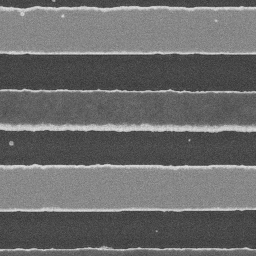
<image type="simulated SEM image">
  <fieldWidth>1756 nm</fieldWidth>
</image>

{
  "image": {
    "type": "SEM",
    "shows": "lines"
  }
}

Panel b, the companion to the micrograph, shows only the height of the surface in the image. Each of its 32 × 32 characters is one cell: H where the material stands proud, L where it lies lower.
LLLLLLLLLLLLLLLLLLLLLLLLLLLLLLLL
HHHHHHHHHHHHHHHHHHHHHHHHHHHHHHHH
HHHHHHHHHHHHHHHHHHHHHHHHHHHHHHHH
HHHHHHHHHHHHHHHHHHHHHHHHHHHHHHHH
HHHHHHHHHHHHHHHHHHHHHHHHHHHHHHHH
HHHHHHHHHHHHHHHHHHHHHHHHHHHHHHHH
HHHHHHHHHHHHHHHHHHHHHHHHHHHHHHHH
LLLLLLLLLLLLLLLLLLLLLLLLLLLLLLLL
LLLLLLLLLLLLLLLLLLLLLLLLLLLLLLLL
LLLLLLLLLLLLLLLLLLLLLLLLLLLLLLLL
LLLLLLLLLLLLLLLLLLLLLLLLLLLLLLLL
HHHHHHHHHHHHHHHHHHHHHHHHHHHHHHHH
HHHHHHHHHHHHHHHHHHHHHHHHHHHHHHHH
HHHHHHHHHHHHHHHHHHHHHHHHHHHHHHHH
HHHHHHHHHHHHHHHHHHHHHHHHHHHHHHHH
HHHHHHHHHHHHHHHHHHHHHHHHHHHHHHHH
LLLLLLLLLLLLLLLLLLLLLLLLLLLLLLLL
LLLLLLLLLLLLLLLLLLLLLLLLLLLLLLLL
LLLLLLLLLLLLLLLLLLLLLLLLLLLLLLLL
LLLLLLLLLLLLLLLLLLLLLLLLLLLLLLLL
LLLLLLLLLLLLLLLLLLLLLLLLLLLLLLLL
HHHHHHHHHHHHHHHHHHHHHHHHHHHHHHHH
HHHHHHHHHHHHHHHHHHHHHHHHHHHHHHHH
HHHHHHHHHHHHHHHHHHHHHHHHHHHHHHHH
HHHHHHHHHHHHHHHHHHHHHHHHHHHHHHHH
HHHHHHHHHHHHHHHHHHHHHHHHHHHHHHHH
LLLLLLLLLLLLLLLLLLLLLLLLLLLLLLLL
LLLLLLLLLLLLLLLLLLLLLLLLLLLLLLLL
LLLLLLLLLLLLLLLLLLLLLLLLLLLLLLLL
LLLLLLLLLLLLLLLLLLLLLLLLLLLLLLLL
LLLLLLLLLLLLLLLLLLLLLLLLLLLLLLLL
HHHHHHHHHHHHHHHHHHHHHHHHHHHHHHHH